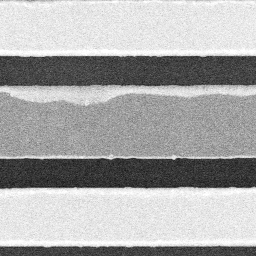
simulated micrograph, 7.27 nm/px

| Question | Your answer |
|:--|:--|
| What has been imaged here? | lines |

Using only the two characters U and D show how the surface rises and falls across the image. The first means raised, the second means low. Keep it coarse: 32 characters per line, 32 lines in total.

UUUUUUUUUUUUUUUUUUUUUUUUUUUUUUUU
UUUUUUUUUUUUUUUUUUUUUUUUUUUUUUUU
UUUUUUUUUUUUUUUUUUUUUUUUUUUUUUUU
UUUUUUUUUUUUUUUUUUUUUUUUUUUUUUUU
UUUUUUUUUUUUUUUUUUUUUUUUUUUUUUUU
UUUUUUUUUUUUUUUUUUUUUUUUUUUUUUUU
UUUUUUUUUUUUUUUUUUUUUUUUUUUUUUUU
DDDDDDDDDDDDDDDDDDDDDDDDDDDDDDDD
DDDDDDDDDDDDDDDDDDDDDDDDDDDDDDDD
DDDDDDDDDDDDDDDDDDDDDDDDDDDDDDDD
DDDDDDDDDDDDDDDDDDDDDDDDDDDDDDDD
UUUUUUUUUUUUUUUUUUUUUUUUUUUUUUUU
UUUUUUUUUUUUUUUUUUUUUUUUUUUUUUUU
UUUUUUUUUUUUUUUUUUUUUUUUUUUUUUUU
UUUUUUUUUUUUUUUUUUUUUUUUUUUUUUUU
UUUUUUUUUUUUUUUUUUUUUUUUUUUUUUUU
UUUUUUUUUUUUUUUUUUUUUUUUUUUUUUUU
UUUUUUUUUUUUUUUUUUUUUUUUUUUUUUUU
UUUUUUUUUUUUUUUUUUUUUUUUUUUUUUUU
UUUUUUUUUUUUUUUUUUUUUUUUUUUUUUUU
DDDDDDDDDDDDDDDDDDDDDDDDDDDDDDDD
DDDDDDDDDDDDDDDDDDDDDDDDDDDDDDDD
DDDDDDDDDDDDDDDDDDDDDDDDDDDDDDDD
DDDDDDDDDDDDDDDDDDDDDDDDDDDDDDDD
UUUUUUUUUUUUUUUUUUUUUUUUUUUUUUUU
UUUUUUUUUUUUUUUUUUUUUUUUUUUUUUUU
UUUUUUUUUUUUUUUUUUUUUUUUUUUUUUUU
UUUUUUUUUUUUUUUUUUUUUUUUUUUUUUUU
UUUUUUUUUUUUUUUUUUUUUUUUUUUUUUUU
UUUUUUUUUUUUUUUUUUUUUUUUUUUUUUUU
UUUUUUUUUUUUUUUUUUUUUUUUUUUUUUUU
DDDDDDDDDDDDDDDDDDDDDDDDDDDDDDDD